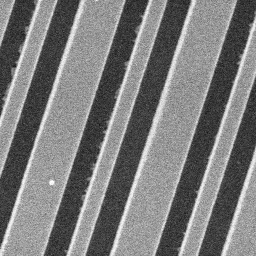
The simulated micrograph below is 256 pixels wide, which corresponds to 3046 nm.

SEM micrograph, lines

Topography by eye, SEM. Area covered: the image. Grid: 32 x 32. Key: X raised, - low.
XX---XX---XXXXXX--XXX---XXXXX---
X---XXX---XXXXX---XX----XXXXX---
X---XX---XXXXXX---XX---XXXXXX---
X---XX---XXXXXX--XXX---XXXXXX---
---XXX---XXXXX---XX----XXXXX---X
---XX---XXXXXX---XX---XXXXXX---X
---XX---XXXXXX---XX---XXXXXX---X
--XXX---XXXXX---XX----XXXXX---XX
--XX---XXXXXX---XX---XXXXXX---XX
--XX---XXXXXX---XX---XXXXXX---XX
-XXX---XXXXX---XX----XXXXX---XXX
-XX---XXXXXX---XX---XXXXXX---XX-
-XX---XXXXXX---XX---XXXXXX---XX-
XXX---XXXXX---XX----XXXXX---XXX-
XX---XXXXXX---XX---XXXXXX---XX--
XX---XXXXXX---XX---XXXXXX---XX--
XX---XXXXX---XXX---XXXXX---XXX--
X---XXXXXX---XX---XXXXXX---XX---
X---XXXXXX---XX---XXXXXX---XX---
X---XXXXX---XXX---XXXXX---XXX---
---XXXXXX---XX---XXXXXX---XX---X
---XXXXXX---XX---XXXXXX---XX---X
---XXXXX---XXX---XXXXX---XXX---X
--XXXXXX---XX---XXXXXX---XX---XX
--XXXXXX---XX---XXXXXX---XX---XX
--XXXXX---XXX---XXXXX---XXX---XX
-XXXXXX---XX----XXXXX---XX---XXX
-XXXXXX---XX---XXXXXX---XX---XXX
-XXXXX---XXX---XXXXX---XXX---XXX
-XXXXX---XX----XXXXX---XX---XXXX
XXXXXX---XX---XXXXXX---XX---XXXX
XXXXXX--XXX---XXXXX---XXX---XXXX